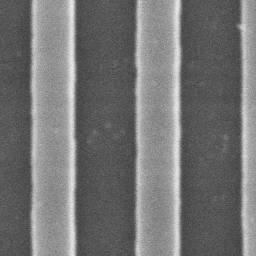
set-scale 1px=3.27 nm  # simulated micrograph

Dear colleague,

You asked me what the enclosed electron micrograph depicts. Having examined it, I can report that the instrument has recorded lines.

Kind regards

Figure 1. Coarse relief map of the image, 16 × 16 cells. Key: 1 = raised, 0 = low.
0011100001100001
0011100001100001
0011100001100001
0011100001100001
0011100001100001
0011100001100001
0011100001100001
0011100001100001
0011100001100001
0011100001100001
0011100001100001
0011100001100001
0011100001100001
0011100001100001
0011100001100001
0011100001100001